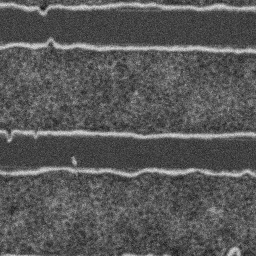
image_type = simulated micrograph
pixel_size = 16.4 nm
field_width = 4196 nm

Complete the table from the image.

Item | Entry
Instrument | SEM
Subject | one or a few lines or trenches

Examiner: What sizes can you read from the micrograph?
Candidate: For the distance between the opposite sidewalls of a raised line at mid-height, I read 649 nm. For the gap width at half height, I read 1410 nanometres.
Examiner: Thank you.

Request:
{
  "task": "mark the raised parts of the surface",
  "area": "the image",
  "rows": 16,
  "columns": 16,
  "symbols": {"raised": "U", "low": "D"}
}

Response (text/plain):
UUDUUUUUUUUUDUUD
UUUUUUUUUUUUUUUU
UUUUUUUUUUUUUUUU
DDDDDDDDDDDDDDDD
DDDDDDDDDDDDDDDD
DDDDDDDDDDDDDDDD
DDDDDDDDDDDDDDDD
DDDDDDDDDDDDDDDD
UUUUUUUUUDUUUUUU
UUUUUUUUUUUUUUUU
UUUUUUUUUUUUUUUU
DDDDDDDDDDDDDDDD
DDDDDDDDDDDDDDDD
DDDDDDDDDDDDDDDD
DDDDDDDDDDDDDDDD
DDDDDDDDDDDDDDDD